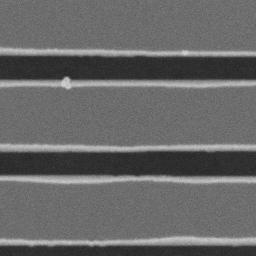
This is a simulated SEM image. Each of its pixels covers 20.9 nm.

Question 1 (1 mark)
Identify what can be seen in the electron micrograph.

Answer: lines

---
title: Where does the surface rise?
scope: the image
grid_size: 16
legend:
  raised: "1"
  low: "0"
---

1111111111111111
1111111111111111
1111111111111111
0000000000000000
0000000000000000
1111111111111111
1111111111111111
1111111111111111
1111111111111111
0000000000000000
0000000000000000
1111111111111111
1111111111111111
1111111111111111
1111111111111111
0000000000000000